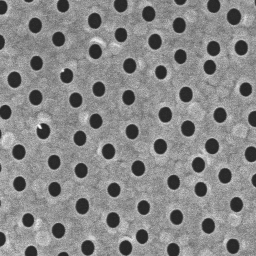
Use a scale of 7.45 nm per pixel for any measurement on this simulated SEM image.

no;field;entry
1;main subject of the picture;a regular array of holes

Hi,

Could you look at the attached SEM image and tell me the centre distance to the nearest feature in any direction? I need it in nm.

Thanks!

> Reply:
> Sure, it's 215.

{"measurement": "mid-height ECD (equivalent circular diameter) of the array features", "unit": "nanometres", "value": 106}